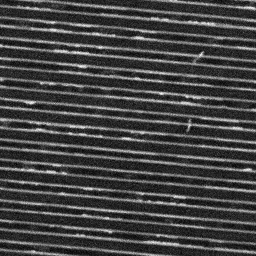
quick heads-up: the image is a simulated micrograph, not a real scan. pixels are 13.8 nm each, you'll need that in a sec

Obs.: parallel lines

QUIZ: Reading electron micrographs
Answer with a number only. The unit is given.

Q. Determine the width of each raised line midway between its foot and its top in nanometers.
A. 134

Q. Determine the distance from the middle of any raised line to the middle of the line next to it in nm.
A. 279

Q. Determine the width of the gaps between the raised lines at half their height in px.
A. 10.7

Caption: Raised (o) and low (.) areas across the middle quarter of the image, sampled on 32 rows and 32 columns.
ooooooo.........................
oooooooooooooooooo..............
....oooooooooooooooooooooooo....
...............ooooooooooooooooo
..........................oooooo
ooooo...........................
oooooooooooooooo................
..ooooooooooooooooooooooooo.....
.............ooooooooooooooooooo
........................oooooooo
oooo............................
oooooooooooooo..................
...oooooooooooooooooooooo.......
..............oooooooooooooooooo
.........................ooooooo
ooooo..........................o
ooooooooooooooo.................
..oooooooooooooooooooooooo......
.............ooooooooooooooooooo
.......................ooooooooo
ooo.............................
oooooooooooooo..................
ooooooooooooooooooooooooo.......
...........ooooooooooooooooooooo
......................oooooooooo
o...............................
oooooooooooo....................
ooooooooooooooooooooooo.........
.........ooooooooooooooooooooooo
....................oooooooooooo
...............................o
ooooooooooo.....................